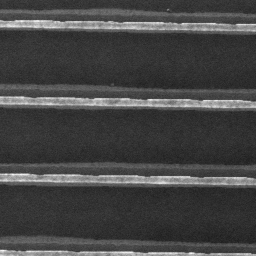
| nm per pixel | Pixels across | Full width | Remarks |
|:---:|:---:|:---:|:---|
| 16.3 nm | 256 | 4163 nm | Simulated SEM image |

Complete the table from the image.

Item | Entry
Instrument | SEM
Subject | lines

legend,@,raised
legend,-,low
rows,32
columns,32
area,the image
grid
--------------------------------
--------------------------------
@@@@@@@@@@@@@@@@@@@@@@@@@@@@@@@@
------@@@@@@@@@@@@@@@@@@@@@@@@@@
--------------------------------
--------------------------------
--------------------------------
--------------------------------
--------------------------------
--------------------------------
--------------------------------
@@@@@@@@@@@@@@@@@@@@@@@@@@@@@@@@
@@@@@@@@@@@@@@@@@@@@@@@@@@@@@@@@
--------------------------@@@@@@
--------------------------------
--------------------------------
--------------------------------
--------------------------------
--------------------------------
--------------------------------
--------------------------------
@@@@@@@@@@@@@@@@@@@@@@@@@@@@@@@@
@@@@@@@@@@@@@@@@@@@@@@@@@@@@@@@@
--------------------------------
--------------------------------
--------------------------------
--------------------------------
--------------------------------
--------------------------------
--------------------------------
@@@@@@@@@@@@@@-@----------------
@@@@@@@@@@@@@@@@@@@@@@@@@@@@@@@@